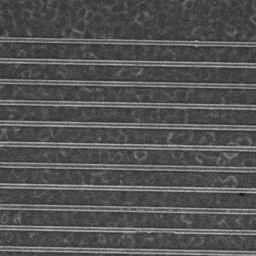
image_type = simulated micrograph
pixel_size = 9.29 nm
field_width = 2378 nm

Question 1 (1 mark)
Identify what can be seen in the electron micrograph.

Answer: parallel lines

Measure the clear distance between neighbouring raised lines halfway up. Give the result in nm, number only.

156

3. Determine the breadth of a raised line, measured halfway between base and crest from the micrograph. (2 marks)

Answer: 34.8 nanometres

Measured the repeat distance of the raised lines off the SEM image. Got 194 nm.